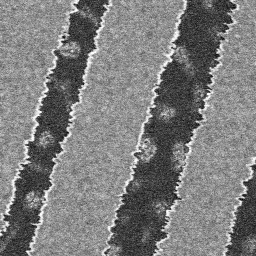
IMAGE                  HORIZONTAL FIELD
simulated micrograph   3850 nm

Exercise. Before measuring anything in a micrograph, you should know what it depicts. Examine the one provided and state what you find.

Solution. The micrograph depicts one or a few lines or trenches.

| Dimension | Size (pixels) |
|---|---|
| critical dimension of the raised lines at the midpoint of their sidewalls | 71.1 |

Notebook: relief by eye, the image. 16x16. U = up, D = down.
UUUUUDDUUUUDDDDU
UUUUDDUUUUUDDDUU
UUUUDDUUUUUDDDUU
UUUDDDUUUUUDDDUU
UUUDDUUUUUDDDUUU
UUUDDUUUUUDDDUUU
UUDDDUUUUDDDDUUU
UUDDUUUUUDDDDUUU
UUDDUUUUUDDDUUUU
UUDDUUUUUDDDUUUU
UDDUUUUUDDDDUUUU
UDDUUUUUDDDUUUUD
UDDUUUUUDDDUUUUD
DDDUUUUDDDDUUUUD
DDUUUUUDDDUUUUDD
DDUUUUUDDDUUUUDD